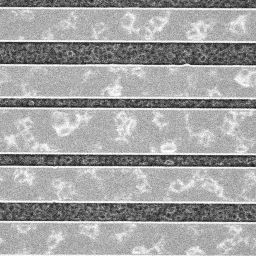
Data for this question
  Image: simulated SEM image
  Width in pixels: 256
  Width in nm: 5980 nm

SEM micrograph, parallel lines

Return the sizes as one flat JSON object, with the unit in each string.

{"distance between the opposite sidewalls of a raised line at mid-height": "797 nanometres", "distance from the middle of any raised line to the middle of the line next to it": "1.24 um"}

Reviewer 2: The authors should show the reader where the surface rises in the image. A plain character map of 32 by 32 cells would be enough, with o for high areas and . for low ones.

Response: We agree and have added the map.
................................
oooooooooooooooooooooooooooooooo
oooooooooooooooooooooooooooooooo
oooooooooooooooooooooooooooooooo
oooooooooooooooooooooooooooooooo
................................
................................
................................
oooooooooooooooooooooooooooooooo
oooooooooooooooooooooooooooooooo
oooooooooooooooooooooooooooooooo
oooooooooooooooooooooooooooooooo
................................
................................
oooooooooooooooooooooooooooooooo
oooooooooooooooooooooooooooooooo
oooooooooooooooooooooooooooooooo
oooooooooooooooooooooooooooooooo
oooooooooooooooooooooooooooooooo
................................
................................
oooooooooooooooooooooooooooooooo
oooooooooooooooooooooooooooooooo
oooooooooooooooooooooooooooooooo
oooooooooooooooooooooooooooooooo
................................
................................
................................
oooooooooooooooooooooooooooooooo
oooooooooooooooooooooooooooooooo
oooooooooooooooooooooooooooooooo
oooooooooooooooooooooooooooooooo